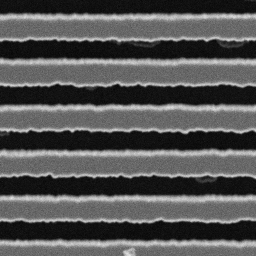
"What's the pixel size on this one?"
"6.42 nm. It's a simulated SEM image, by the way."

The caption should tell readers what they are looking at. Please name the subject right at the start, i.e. lines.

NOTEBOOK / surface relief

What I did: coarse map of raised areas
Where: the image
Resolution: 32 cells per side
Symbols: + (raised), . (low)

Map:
................................
................................
++++++++++++++++++++++++++++++++
++++++++++++++++++++++++++++++++
++++++++++++++++++++++++++++++++
................................
................................
++++++++++++++++++++++++++++++++
++++++++++++++++++++++++++++++++
++++++++++++++++++++++++++++++++
++++++++++++++++++++++++++++++++
................................
................................
++++++++++++++++++++++++++++++++
++++++++++++++++++++++++++++++++
++++++++++++++++++++++++++++++++
....................+..+.....++.
................................
................................
++++++++++++++++++++++++++++++++
++++++++++++++++++++++++++++++++
++++++++++++++++++++++++++++++++
................................
................................
+++++++++..++.++++.+++++.+++++++
++++++++++++++++++++++++++++++++
++++++++++++++++++++++++++++++++
++++++++++++++++++++++++++++++++
................................
................................
++++++++++++++++++++++++++++++++
++++++++++++++++++++++++++++++++